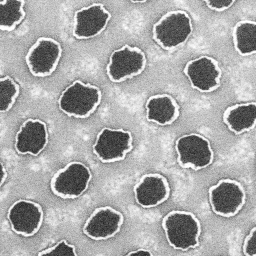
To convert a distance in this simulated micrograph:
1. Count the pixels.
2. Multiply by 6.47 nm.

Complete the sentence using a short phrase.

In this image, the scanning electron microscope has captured a regular array of raised bodies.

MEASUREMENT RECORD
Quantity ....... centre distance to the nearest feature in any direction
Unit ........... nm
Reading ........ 350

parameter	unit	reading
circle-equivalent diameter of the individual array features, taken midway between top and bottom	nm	228